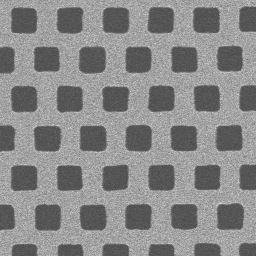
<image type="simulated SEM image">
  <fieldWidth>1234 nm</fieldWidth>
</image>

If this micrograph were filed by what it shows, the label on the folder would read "a regular array of holes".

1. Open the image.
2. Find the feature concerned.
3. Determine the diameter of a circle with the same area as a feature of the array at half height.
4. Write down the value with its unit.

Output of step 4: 137 nm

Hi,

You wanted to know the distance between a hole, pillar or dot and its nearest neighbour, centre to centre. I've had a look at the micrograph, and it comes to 217 nm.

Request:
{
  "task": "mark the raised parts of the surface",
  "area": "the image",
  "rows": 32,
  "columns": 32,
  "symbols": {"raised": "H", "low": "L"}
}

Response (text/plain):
HHHHHHHHHHHHHHHHHHHHHHHHHHHHHHHH
HLLLLHHLLLHHHLLLHHHLLLHHLLLHHHLL
HLLLLHHLLLHHHLLLHHHLLLHHLLLHHHLL
HLLLLHHLLLHHHLLLHHLLLLHHLLLHHHLL
HHHHHHHHHHHHHHHHHHHHHHHHHHHHHHHH
HHHHHHHHHHHHHHHHHHHHHHHHHHHHHHHH
LLHHLLLHHHLLLHHHLLLHHLLLLHHLLLHH
LLHHLLLLHHLLLHHHLLLHHLLLLHHLLLHH
LLHHLLLHHHLLLHHHLLLHHLLLLHHLLLHH
HHHHHHHHHHHHHHHHHHHHHHHHHHHHHHHH
HHHHHHHHHHHHHHHHHHHHHHHHHHHHHHHH
HLLLLHHLLLHHHLLLHHHLLLHHLLLLHHLL
HLLLLHHLLLHHHLLLHHHLLLHHLLLLHHLL
HHLLLHHLLLHHHLLLHHHLLLHHLLLHHHLL
HHHHHHHHHHHHHHHHHHHHHHHHHHHHHHHH
HHHHHHHHHHHHHHHHHHHHHHHHHHHHHHHH
LLHHLLLLHHLLLHHHLLLHHLLLLHHLLLHH
LLHHLLLLHHLLLHHHLLLHHLLLLHHLLLHH
LLHHLLLHHHLLLHHHLLLHHHLLLHHLLLHH
HHHHHHHHHHHHHHHHHHHHHHHHHHHHHHHH
HHHHHHHHHHHHHHHHHHHHHHHHHHHHHHHH
HLLLLHHLLLHHHLLLHHHLLLHHLLLLHHLL
HLLLLHHLLLHHHLLLHHLLLLHHLLLLHHLL
HHLLHHHLLLHHHLLLHHHLLLHHLLLHHHLL
HHHHHHHHHHHHHHHHHHHHHHHHHHHHHHHH
HHHHHLLHHHHHHHHHLLHHHHLLHHHHHLHH
LLHHLLLLHHLLLHHHLLLHHLLLLHHLLLHH
LLHHLLLLHHLLLHHHLLLHHLLLLHHLLLHH
LLHHHLLHHHLLLHHHLLLHHHLLHHHLLLHH
HHHHHHHHHHHHHHHHHHHHHHHHHHHHHHHH
HHHLHHHHHHHHHHLLHHHLLHHHHLLHHHLL
HLLLLHHLLLHHHLLLHHLLLLHHLLLLHHLL